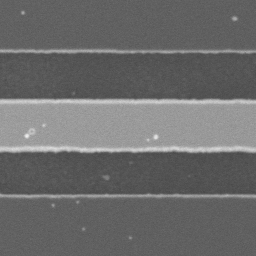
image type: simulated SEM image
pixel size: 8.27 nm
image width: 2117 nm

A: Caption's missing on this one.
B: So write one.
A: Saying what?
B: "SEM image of lines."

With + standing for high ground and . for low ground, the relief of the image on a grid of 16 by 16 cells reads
++++++++++++++++
++++++++++++++++
++++++++++++++++
................
................
................
++++++++++++++++
++++++++++++++++
++++++++++++++++
................
................
................
++++++++++++++++
++++++++++++++++
++++++++++++++++
++++++++++++++++